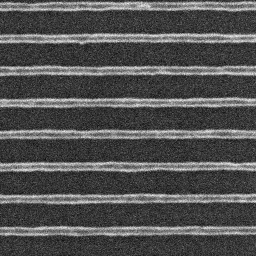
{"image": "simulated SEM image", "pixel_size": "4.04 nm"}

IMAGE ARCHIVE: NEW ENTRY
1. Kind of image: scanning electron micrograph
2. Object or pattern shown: parallel lines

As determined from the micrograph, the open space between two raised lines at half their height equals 102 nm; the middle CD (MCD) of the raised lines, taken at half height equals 26.8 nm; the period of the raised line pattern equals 130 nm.